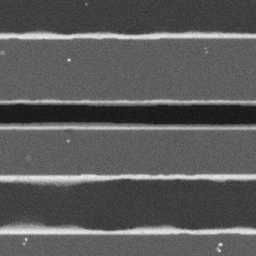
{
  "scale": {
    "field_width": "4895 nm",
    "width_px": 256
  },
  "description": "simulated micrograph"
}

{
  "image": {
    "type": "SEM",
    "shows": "lines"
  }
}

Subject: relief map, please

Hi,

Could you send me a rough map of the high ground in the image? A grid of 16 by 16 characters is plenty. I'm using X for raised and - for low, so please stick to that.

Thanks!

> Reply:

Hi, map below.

----------------
----------------
XXXXXXXXXXXXXXXX
XXXXXXXXXXXXXXXX
XXXXXXXXXXXXXXXX
XXXXXXXXXXXXXXXX
----------------
----------------
XXXXXXXXXXXXXXXX
XXXXXXXXXXXXXXXX
XXXXXXXXXXXXXXXX
----------------
----------------
----------------
-X--------------
XXXXXXXXXXXXXXXX